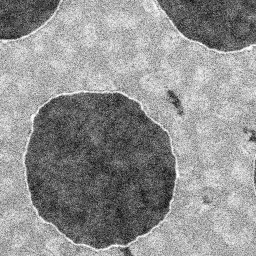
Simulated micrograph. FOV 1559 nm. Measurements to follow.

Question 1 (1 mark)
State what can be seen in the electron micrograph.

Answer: raised bodies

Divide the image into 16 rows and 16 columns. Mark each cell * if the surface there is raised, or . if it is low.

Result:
****......******
***........*****
*...........****
................
................
................
...******.......
..********......
..*********.....
..*********.....
..*********.....
..*********.....
..*********.....
..********......
....*****.......
......*.........